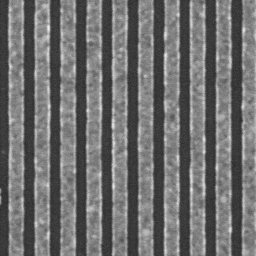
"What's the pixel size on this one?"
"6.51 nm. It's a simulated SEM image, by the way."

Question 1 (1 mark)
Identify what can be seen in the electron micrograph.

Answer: parallel lines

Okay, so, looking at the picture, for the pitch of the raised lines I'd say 0.169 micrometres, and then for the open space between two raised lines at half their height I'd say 82.2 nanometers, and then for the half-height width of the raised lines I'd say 13.5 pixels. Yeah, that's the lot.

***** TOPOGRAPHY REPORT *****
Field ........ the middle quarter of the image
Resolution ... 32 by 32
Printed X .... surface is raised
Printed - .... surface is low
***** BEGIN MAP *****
XXX---XXX---XXXX---XXX---XXXX---
XXX---XXX---XXXX---XXX---XXX----
XXX---XXX---XXXX---XXX---XXXX---
XXX---XXX---XXXX---XXX---XXXX---
XXX---XXX---XXXX---XXX---XXX----
XXX---XXX---XXXX---XXX---XXXX---
XXX---XXX---XXXX---XXX---XXXX---
XXX---XXX---XXXX---XXX---XXXX---
XXX---XXX---XXXX---XXX---XXX----
XXX---XXX---XXX----XXX---XXX----
XXX---XXX---XXXX---XXX---XXX----
XXX---XXX---XXX----XXX---XXX----
XXX---XXX---XXX----XXX---XXX----
XXX---XXX---XXXX---XXX---XXX----
XXX---XXX---XXXX---XXX---XXX----
XXX---XXX---XXX----XXX---XXX----
XXX---XXX---XXXX---XXX---XXX----
XXX---XXX---XXXX---XXX---XXX----
XXX---XXX---XXXX---XXX---XXXX---
XXX---XXX---XXXX---XXX---XXX----
XXX---XXX---XXX----XXX---XXX----
XXX---XXX---XXXX---XXX---XXX----
XXX---XXX---XXXX---XXX---XXX----
XXX---XXX----XXX---XXX---XXX----
XXX---XXX---XXXX---XXX---XXX----
XXX---XXX---XXXX---XXX---XXX----
XXX---XXX---XXXX---XXX---XXX----
XXX---XXX---XXXX---XXX---XXX----
XXX---XXX---XXXX---XXX---XXX----
XXX---XXX---XXXX---XXX---XXX----
XXX---XXX---XXX----XXX---XXXX---
XXX---XXX---XXXX---XXX---XXXX---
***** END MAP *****